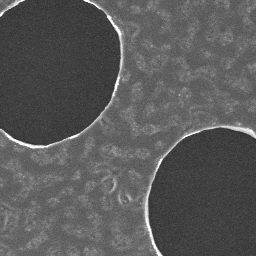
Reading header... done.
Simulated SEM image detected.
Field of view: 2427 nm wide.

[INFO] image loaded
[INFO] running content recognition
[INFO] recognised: holes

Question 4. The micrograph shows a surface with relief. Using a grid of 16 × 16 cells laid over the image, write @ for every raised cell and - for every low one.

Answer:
@-----@@@@@@@@@@
-------@@@@@@@@@
-------@@@@@@@@@
--------@@@@@@@@
-------@@@@@@@@@
-------@@@@@@@@@
-------@@@@@@@@@
------@@@@@@@@@@
@----@@@@@@@----
@@@@@@@@@@@-----
@@@@@@@@@@------
@@@@@@@@@@------
@@@@@@@@@-------
@@@@@@@@@-------
@@@@@@@@@-------
@@@@@@@@@@------